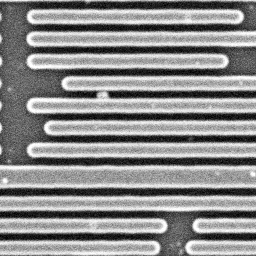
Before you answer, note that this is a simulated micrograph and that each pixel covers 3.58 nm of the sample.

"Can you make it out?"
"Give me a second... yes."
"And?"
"groups of lines, slits or small figures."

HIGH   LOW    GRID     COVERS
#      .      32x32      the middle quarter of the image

################################
................................
................................
..........#.####....############
################################
################################
................................
................................
................................
################################
################################
################################
................................
................................
################################
################################
################################
################################
................................
................................
################################
################################
################################
................................
................................
................................
################################
################################
################################
################################
################################
................................